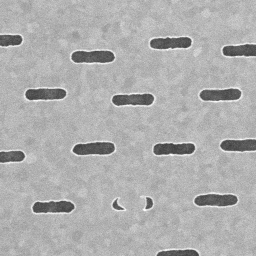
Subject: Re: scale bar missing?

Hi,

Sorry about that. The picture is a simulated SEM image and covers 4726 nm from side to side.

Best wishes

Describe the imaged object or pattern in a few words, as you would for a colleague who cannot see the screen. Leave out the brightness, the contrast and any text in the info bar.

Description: a regular array of holes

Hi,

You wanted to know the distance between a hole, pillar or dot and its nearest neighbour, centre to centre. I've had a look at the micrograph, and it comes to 1180 nanometers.